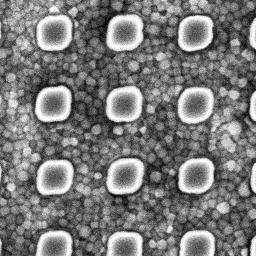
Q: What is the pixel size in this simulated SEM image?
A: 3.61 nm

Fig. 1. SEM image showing a regular array of raised bodies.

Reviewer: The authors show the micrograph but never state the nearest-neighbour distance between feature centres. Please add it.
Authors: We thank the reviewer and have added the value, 70.7 pixels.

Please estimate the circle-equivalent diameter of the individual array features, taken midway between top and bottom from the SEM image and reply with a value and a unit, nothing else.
126 nm